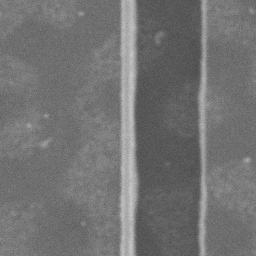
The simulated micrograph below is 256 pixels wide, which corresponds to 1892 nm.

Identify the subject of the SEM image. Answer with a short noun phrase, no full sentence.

lines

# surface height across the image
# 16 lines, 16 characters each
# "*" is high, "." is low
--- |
********.....***
********.....***
********.....***
********.....***
********.....***
********.....***
********.....***
********.....***
********.....***
********.....***
********.....***
********.....***
********.....***
********.....***
********.....***
********.....***